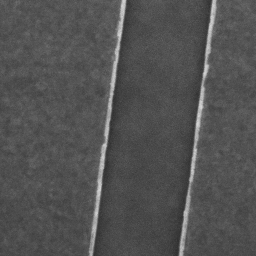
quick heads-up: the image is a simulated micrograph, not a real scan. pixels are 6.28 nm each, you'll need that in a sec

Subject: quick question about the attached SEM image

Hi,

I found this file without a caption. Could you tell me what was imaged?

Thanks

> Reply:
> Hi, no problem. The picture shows one or a few lines or trenches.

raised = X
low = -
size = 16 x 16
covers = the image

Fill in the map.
XXXXXXXX-----XXX
XXXXXXXX-----XXX
XXXXXXX------XXX
XXXXXXX------XXX
XXXXXXX------XXX
XXXXXXX------XXX
XXXXXXX-----XXXX
XXXXXXX-----XXXX
XXXXXXX-----XXXX
XXXXXXX-----XXXX
XXXXXX------XXXX
XXXXXX------XXXX
XXXXXX------XXXX
XXXXXX------XXXX
XXXXXX-----XXXXX
XXXXXX-----XXXXX